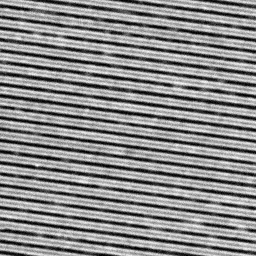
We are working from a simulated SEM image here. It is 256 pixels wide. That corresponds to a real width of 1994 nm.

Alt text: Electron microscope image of parallel lines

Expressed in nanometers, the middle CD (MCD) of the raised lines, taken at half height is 40.6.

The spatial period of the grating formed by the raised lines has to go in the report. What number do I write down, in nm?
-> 86.4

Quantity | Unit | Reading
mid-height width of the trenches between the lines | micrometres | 0.0463